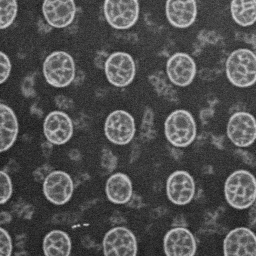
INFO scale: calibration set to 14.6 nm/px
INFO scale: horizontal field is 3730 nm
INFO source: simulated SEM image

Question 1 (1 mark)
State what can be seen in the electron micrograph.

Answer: a regular array of raised bodies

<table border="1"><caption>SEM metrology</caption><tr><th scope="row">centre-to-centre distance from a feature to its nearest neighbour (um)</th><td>0.858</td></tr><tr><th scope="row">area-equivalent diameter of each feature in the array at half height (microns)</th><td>0.442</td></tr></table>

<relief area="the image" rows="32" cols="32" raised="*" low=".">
**...****....****....***.....***
**...****....****....***.....***
**....***.....***....***......**
...............*................
................................
................................
.............................**.
*.....***.....***....***.....***
*.....***....****....***....****
*.....***....****....***.....***
......**......**......*......**.
................................
................................
*...............................
**....**......**.....***.....**.
**....***....****....***.....***
**....***....****....***.....***
**....**......**.....***.....***
*...............................
................................
................................
..............................*.
*.....***.....**.....***....****
*.....***....***.....***....****
*.....***.....**.....***....****
.............................**.
................................
................................
................................
*.....**.....****....***....****
*.....***....****....***....****
*.....***....****....***....****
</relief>